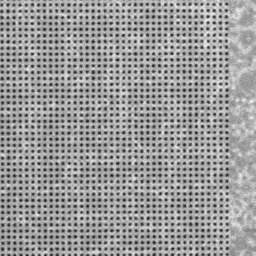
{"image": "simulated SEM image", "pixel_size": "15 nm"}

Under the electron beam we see a regular array of holes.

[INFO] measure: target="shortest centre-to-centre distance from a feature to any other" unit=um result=0.0899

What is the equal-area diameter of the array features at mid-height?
56.3 nm